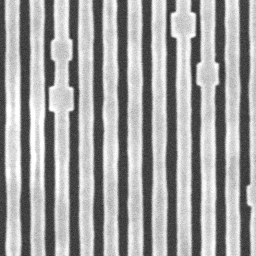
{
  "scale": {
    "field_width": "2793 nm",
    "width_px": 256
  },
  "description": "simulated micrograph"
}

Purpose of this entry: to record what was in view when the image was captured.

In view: wiring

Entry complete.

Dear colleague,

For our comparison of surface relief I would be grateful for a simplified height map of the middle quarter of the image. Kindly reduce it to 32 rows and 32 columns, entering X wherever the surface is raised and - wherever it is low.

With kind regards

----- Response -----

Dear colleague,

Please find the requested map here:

X---XXX---XXX---XXX---XXX---XXX-
X---XXX---XXX---XXX---XXX---XXX-
X---XXX---XXX---XXX---XXX---XXXX
X---XXX---XXX---XXX---XXX---XXXX
X---XXX---XXX---XXX---XXX---XXXX
X---XXX---XXX---XXX---XXX---XXXX
XX--XXX---XXX---XXX---XXX---XXXX
XX--XXX---XXX---XXX---XXX---XXX-
XX--XXX---XXX---XXX---XXX---XXX-
XX--XXX---XXX---XXX---XXX---XXX-
XX--XXX---XXX---XXX---XXX---XXXX
XX--XXX---XXX---XXX---XXX---XXXX
X---XXX---XXX---XXX---XXX---XXXX
X---XXX---XXX---XXX---XXX---XXX-
X---XXX---XXX---XXX---XXX---XXX-
X---XXX---XXX---XXX---XXX---XXX-
X---XXX---XXX---XXX---XXX---XXX-
X---XXX---XXX---XXX---XXX---XXXX
X---XXX---XXX---XXX---XXX---XXXX
X---XXX---XXX---XXX---XXX---XXXX
X---XXX---XXX---XXX---XXX---XXXX
X---XXX---XXX---XXX---XXX---XXXX
X---XXX---XXX---XXX---XXX----XXX
X---XXX---XXX---XXX---XXX---XXXX
X---XXX---XXX---XXX---XXX---XXXX
X---XXX---XXX---XXX---XXX---XXXX
X---XXX---XXX---XXX---XXX---XXXX
X---XXX---XXX---XXX---XXX---XXXX
X---XXX---XXX---XXX---XXX---XXXX
X---XXX---XXX---XXX---XXX---XXXX
X---XXX---XXX---XXX---XXX---XXXX
X---XXX---XXX---XXX---XXX---XXXX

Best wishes